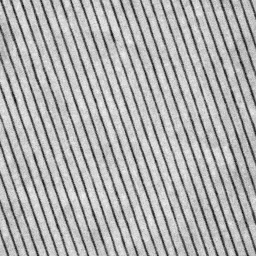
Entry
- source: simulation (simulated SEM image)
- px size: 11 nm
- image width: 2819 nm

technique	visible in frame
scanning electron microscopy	parallel lines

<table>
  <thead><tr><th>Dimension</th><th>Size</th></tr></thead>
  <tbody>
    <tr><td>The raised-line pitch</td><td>104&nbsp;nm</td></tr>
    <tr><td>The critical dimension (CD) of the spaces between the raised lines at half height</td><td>2.6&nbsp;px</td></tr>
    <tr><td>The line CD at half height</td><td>0.0769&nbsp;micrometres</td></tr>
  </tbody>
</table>